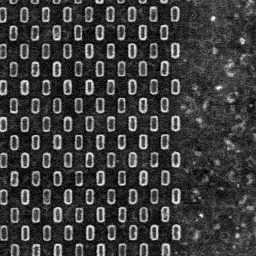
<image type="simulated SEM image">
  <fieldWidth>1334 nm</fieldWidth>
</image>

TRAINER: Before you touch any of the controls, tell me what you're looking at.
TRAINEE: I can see a regular array of raised bodies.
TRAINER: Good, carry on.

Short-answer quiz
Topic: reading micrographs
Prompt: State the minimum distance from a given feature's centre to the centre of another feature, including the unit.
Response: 108 nm